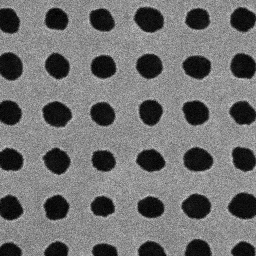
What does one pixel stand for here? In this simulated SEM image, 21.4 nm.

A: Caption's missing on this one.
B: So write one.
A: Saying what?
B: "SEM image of a regular array of holes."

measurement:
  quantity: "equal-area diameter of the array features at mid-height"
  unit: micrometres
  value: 0.564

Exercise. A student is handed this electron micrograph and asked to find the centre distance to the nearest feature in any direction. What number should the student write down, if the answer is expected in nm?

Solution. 984